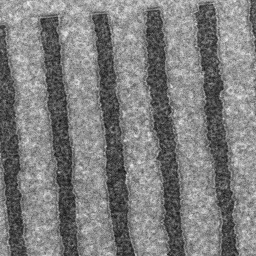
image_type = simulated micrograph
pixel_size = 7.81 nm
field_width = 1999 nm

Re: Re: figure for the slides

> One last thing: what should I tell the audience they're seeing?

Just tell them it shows parallel lines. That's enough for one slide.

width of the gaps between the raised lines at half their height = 34 pixels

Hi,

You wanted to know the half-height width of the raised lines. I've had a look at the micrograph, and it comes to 135 nanometres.